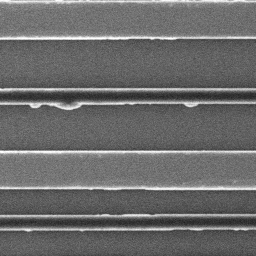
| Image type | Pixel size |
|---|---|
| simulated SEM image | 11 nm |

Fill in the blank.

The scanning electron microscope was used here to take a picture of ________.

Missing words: lines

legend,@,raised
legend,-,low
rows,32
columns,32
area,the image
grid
@@@@@@@@@@@@@@@@@@@@@@@@@@@@@@@@
@@@@@@@@@@@@@@@@@@@@@@@@@@@@@@@@
@@@@@@@@@@@@@@@@@@@@@@@@@@@@@@@@
@@@@@@@@@@@@@@@@@@@@@@@@@@@@@@@@
@@@@@@@@@@@@@@@@@@@@@@@@@@@@@@@@
--------------------------------
--------------------------------
--------------------------------
--------------------------------
--------------------------------
--------------------------------
@@@@@@@@@@@@@@@@@@@@@@@@@@@@@@@@
@@@@@@@@@@@@@@@@@@@@@@@@@@@@@@@@
--------@-----------------------
--------------------------------
--------------------------------
--------------------------------
--------------------------------
--------------------------------
@@@@@@@@@@@@@@@@@@@@@@@@@@@@@@@@
@@@@@@@@@@@@@@@@@@@@@@@@@@@@@@@@
@@@@@@@@@@@@@@@@@@@@@@@@@@@@@@@@
@@@@@@@@@@@@@@@@@@@@@@@@@@@@@@@@
@@@@@@@@@@@@@@@@@@@@@@@@@@@@@@@@
--------------------------------
--------------------------------
--------------------------------
@@@@@@@@@@@@@@@@@@@@@@@@@@@@@@@@
@@@@@@@@@@@@@@@@@@@@@@@@@@@@@@@@
--------------------------------
--------------------------------
--------------------------------